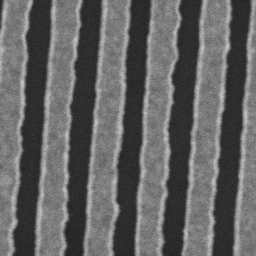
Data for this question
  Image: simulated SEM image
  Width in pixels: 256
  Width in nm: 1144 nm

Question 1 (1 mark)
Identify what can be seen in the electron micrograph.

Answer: lines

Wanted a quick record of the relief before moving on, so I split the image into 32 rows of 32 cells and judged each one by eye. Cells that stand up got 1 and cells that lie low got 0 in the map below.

01110001110001110001110001111000
11110001110001110001110001111001
11100001110001110001111001111001
11100001110001110001110001111001
11100001110001110001110001111001
11100011110001110011110001111001
11100011100011110011110001110001
11100011100011110011110001110001
11100011100011110011110001110001
11100011100011110011100001110001
11100011100011110011110001110001
11100011100011110011110011110001
11100011100011110011110011110001
11100011100011100011100011110001
11100011100011100011100011110001
11100011100011100011100011110001
11100111100011100011100011100011
11100111100011100011100011100011
11100111100111100011100011100011
11100111000111100011100011100011
11000111000111100011100011100011
11000111000111100011100011100011
11000111100111100011100011100011
11000111000111000111100011100011
11000111000111000111100011100011
11000111000111100111000111100011
11000111000111100111000111000011
11000111000111000111000111100011
11000111000111000111000111000111
10000111000111000111000111000111
11000111000111000111000111000111
11000111000111000111000111000111